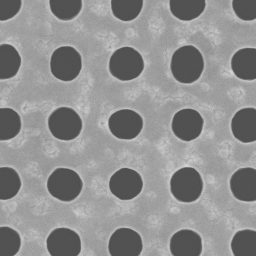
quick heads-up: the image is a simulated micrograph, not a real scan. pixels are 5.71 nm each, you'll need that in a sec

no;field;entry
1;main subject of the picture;a regular array of holes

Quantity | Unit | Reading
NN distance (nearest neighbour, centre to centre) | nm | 344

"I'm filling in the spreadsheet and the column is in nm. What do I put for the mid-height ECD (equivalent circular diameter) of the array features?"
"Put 188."